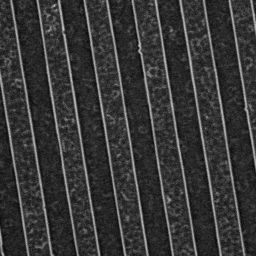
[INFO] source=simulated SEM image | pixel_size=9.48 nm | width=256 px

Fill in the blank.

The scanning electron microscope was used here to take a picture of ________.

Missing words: parallel lines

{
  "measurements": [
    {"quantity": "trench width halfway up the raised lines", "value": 234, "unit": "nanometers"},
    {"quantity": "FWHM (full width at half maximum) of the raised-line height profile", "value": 0.225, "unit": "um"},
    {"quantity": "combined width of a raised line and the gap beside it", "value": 47.5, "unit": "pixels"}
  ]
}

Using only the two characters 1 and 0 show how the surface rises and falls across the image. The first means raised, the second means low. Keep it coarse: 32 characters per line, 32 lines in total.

11000110000110000111000111000110
11000111000111000111000111000111
11000111000111000111000111000111
11000111000111000111000111000111
11000111000111000111000111000111
11000111000111000111000111000011
11000011000011100111100011100011
11100011100011100011100011100011
11100011100011100011100011100011
11100011100011100011100011100011
11100011100011100011100011100011
11100011100011100011100011100011
11100001100001100001100001100001
01110001100001110001110001110001
01110001110001110001110001110001
01110001110001110001110001110001
01110001110001110001110001110001
01110001110001110001110001110001
01110000110000110001110001110000
00111000110000111000111000111000
00111000111000111000111000111000
00111000111000111000111000111000
00111000111000111000111000111000
00111000111000111000111000111000
00111000111000111000111000111000
00011000011000011000011100011100
00011100011100011100011100011100
00011100011100011100011100011100
00011100011100011100011100011100
00011100011100011100011100011100
00011100011100011100011100011100
00011100001100001100001110001110